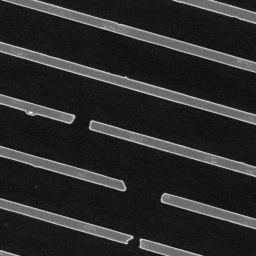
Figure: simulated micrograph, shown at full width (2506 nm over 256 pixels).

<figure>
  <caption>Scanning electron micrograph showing parallel lines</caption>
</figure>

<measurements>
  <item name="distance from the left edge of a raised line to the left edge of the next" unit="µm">0.489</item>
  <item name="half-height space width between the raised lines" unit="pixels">40.3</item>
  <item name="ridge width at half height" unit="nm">94.1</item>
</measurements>